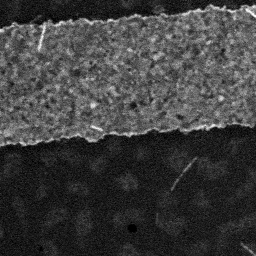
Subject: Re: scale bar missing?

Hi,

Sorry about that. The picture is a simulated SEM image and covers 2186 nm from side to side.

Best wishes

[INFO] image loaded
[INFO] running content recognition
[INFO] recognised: one or a few lines or trenches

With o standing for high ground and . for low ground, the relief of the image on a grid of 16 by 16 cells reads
.............o.o
...ooooooooooooo
oooooooooooooooo
oooooooooooooooo
oooooooooooooooo
oooooooooooooooo
oooooooooooooooo
oooooooooooooooo
ooooooo.........
................
................
................
................
................
................
................